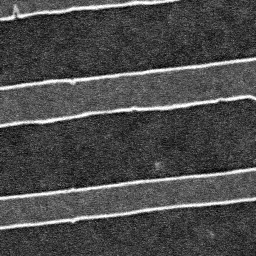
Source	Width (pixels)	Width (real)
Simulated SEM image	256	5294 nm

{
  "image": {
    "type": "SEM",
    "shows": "one or a few lines or trenches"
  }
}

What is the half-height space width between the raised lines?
1470 nanometers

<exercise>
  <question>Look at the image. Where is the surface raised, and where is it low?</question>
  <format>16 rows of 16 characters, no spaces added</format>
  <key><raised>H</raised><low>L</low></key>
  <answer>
HHHHHLLLLLLLLLLL
LLLLLLLLLLLLLLLL
LLLLLLLLLLLLLLLL
LLLLLLLLLLLLLLLL
LLLLLLLLLHHHHHHH
HHHHHHHHHHHHHHHH
HHHHHHHHHHHHLLLL
HHHLLLLLLLLLLLLL
LLLLLLLLLLLLLLLL
LLLLLLLLLLLLLLLL
LLLLLLLLLLLLLLLL
LLLLLLLLHHHHHHHH
HHHHHHHHHHHHHHHH
HHHHHHLLLLLLLLLL
LLLLLLLLLLLLLLLL
LLLLLLLLLLLLLLLL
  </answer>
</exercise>